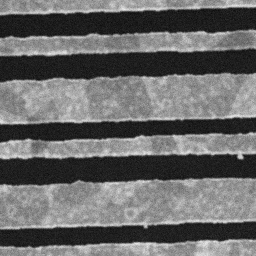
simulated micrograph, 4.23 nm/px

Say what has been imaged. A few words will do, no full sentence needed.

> lines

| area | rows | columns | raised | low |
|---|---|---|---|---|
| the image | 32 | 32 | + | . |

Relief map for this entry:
++++++++++++++++++++++++++++++++
+++++++++.......................
................................
................................
...........+++++++++++++++++++++
++++++++++++++++++++++++++++++++
+++++++++.......................
................................
................................
.....................+++++++++++
++++++++++++++++++++++++++++++++
++++++++++++++++++++++++++++++++
++++++++++++++++++++++++++++++++
++++++++++++++++++++++++++++++++
++++++++++++++++++++++++++++++++
................................
................................
.............+++++++++++++++++++
++++++++++++++++++++++++++++++++
++++.+++........................
................................
................................
...................+...+++++++++
++++++++++++++++++++++++++++++++
++++++++++++++++++++++++++++++++
++++++++++++++++++++++++++++++++
+.++++++++++++++++++++++++++++++
+++++++++++++++++++++++++++++++.
++..............................
................................
................++++..++++++++++
++++++++++++++++++++++++++++++++